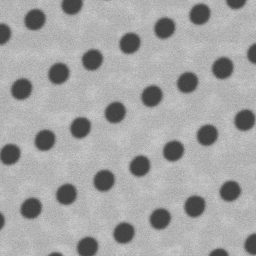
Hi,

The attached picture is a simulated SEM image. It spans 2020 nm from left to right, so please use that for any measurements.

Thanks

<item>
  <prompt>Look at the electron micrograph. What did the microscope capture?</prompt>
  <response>a regular array of holes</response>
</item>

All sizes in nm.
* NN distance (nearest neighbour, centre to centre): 299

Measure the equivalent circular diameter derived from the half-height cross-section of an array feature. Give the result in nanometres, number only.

165